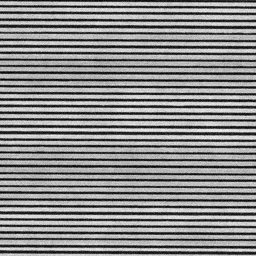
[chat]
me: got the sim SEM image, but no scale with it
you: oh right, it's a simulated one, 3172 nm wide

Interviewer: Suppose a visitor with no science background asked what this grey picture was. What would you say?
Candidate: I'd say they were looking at parallel lines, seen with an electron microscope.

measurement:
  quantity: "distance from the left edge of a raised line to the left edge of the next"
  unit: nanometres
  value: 82.3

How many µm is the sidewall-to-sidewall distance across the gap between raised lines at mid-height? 0.0325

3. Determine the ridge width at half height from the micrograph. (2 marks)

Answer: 4.25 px